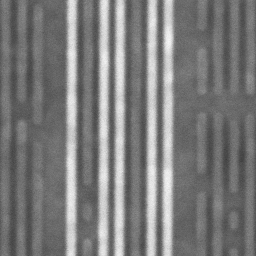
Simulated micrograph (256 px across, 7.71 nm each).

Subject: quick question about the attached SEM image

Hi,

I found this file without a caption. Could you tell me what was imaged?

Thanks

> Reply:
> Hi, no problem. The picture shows groups of lines, slits or small figures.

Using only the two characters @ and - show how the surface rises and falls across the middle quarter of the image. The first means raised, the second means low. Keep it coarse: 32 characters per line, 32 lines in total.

-@@--@@--@@--@@--@@--@@--@@-----
-@@--@@--@@--@@--@@--@@--@@-----
-@@--@@--@@--@@--@@--@@--@@-----
-@@--@@--@@--@@--@@--@@--@@-----
-@@--@@--@@--@@--@@--@@--@@-----
-@@--@@--@@--@@--@@--@@--@@-----
-@@--@@--@@--@@--@@--@@--@@-----
-@@--@@--@@--@@--@@--@@--@@-----
-@@--@@--@@--@@--@@--@@--@@-----
-@@--@@--@@--@@--@@--@@--@@-----
-@@--@@--@@--@@--@@--@@--@@-----
-@@--@@--@@--@@--@@--@@--@@-----
-@@--@@--@@--@@--@@--@@--@@-----
-@@--@@--@@--@@--@@--@@--@@-----
-@@--@@--@@--@@--@@--@@--@@-----
-@@--@@--@@--@@--@@--@@--@@-----
-@@--@@--@@--@@--@@--@@--@@-----
-@@--@@--@@--@@--@@--@@--@@-----
-@@--@@--@@--@@--@@--@@--@@-----
-@@--@@--@@--@@--@@--@@--@@-----
-@@--@@--@@--@@--@@--@@--@@-----
-@@--@@--@@--@@--@@--@@--@@-----
-@@--@@--@@--@@--@@--@@--@@-----
-@@--@@--@@--@@--@@--@@--@@-----
-@@--@@--@@--@@--@@--@@--@@-----
-@@--@@--@@--@@--@@--@@--@@-----
-@@--@@--@@--@@--@@--@@--@@-----
-@@--@@--@---@@--@@--@@--@@-----
-@@--@@--@---@@--@@--@@--@@-----
-@@--@@--@---@@--@@--@@--@@-----
-@@------@---@@--@@--@@--@@-----
-@@------@@--@@--@@--@@--@@-----